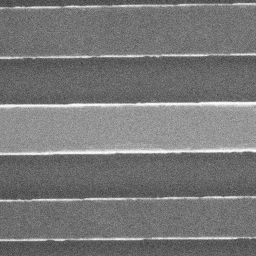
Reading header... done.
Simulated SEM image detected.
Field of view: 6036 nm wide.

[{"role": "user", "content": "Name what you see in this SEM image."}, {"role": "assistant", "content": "lines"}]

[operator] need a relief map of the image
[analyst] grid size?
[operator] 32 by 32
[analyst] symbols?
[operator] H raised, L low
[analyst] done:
LLLLLLLLLLLLLLLLLLLLLLLLLLLLLHHH
HHHHHHHHHHHHHHHHHHHHHHHHHHHHHHHH
HHHHHHHHHHHHHHHHHHHHHHHHHHHHHHHH
HHHHHHHHHHHHHHHHHHHHHHHHHHHHHHHH
HHHHHHHHHHHHHHHHHHHHHHHHHHHHHHHH
HHHHHHHHHHHHHHHHHHHHHHHHHHHHHHHH
HHHHHHHHHHHHHHHHHHHHHHHHHHHHHHHH
LLLLLLLLLLLLLLLLLLLLLLLLLLLLLLLL
LLLLLLLLLLLLLLLLLLLLLLLLLLLLLLLL
LLLLLLLLLLLLLLLLLLLLLLLLLLLLLLLL
LLLLLLLLLLLLLLLLLLLLLLLLLLLLLLLL
LLLLLLLLLLLLLLLLLLLLLLLLLLLLLLLL
LLLLLLLLLLLLLLLLLLLLLLLLLLLLLLLL
HHHHHHHHHHHHHHHHHHHHHHHHHHHHHHHH
HHHHHHHHHHHHHHHHHHHHHHHHHHHHHHHH
HHHHHHHHHHHHHHHHHHHHHHHHHHHHHHHH
HHHHHHHHHHHHHHHHHHHHHHHHHHHHHHHH
HHHHHHHHHHHHHHHHHHHHHHHHHHHHHHHH
HHHHHHHHHHHHHHHHHHHHHHHHHHHHHHHH
LLLLLLLLLLLLLLLLLLLLLLLLLLLLLLLL
LLLLLLLLLLLLLLLLLLLLLLLLLLLLLLLL
LLLLLLLLLLLLLLLLLLLLLLLLLLLLLLLL
LLLLLLLLLLLLLLLLLLLLLLLLLLLLLLLL
LLLLLLLLLLLLLLLLLLLLLLLLLLLLLLLL
LLLLLLLLLLLLLLLLLLLLLLLLLLLLLLLL
HHHHHHHHHHHHHHHHHHHHHHHHHHHHHHHH
HHHHHHHHHHHHHHHHHHHHHHHHHHHHHHHH
HHHHHHHHHHHHHHHHHHHHHHHHHHHHHHHH
HHHHHHHHHHHHHHHHHHHHHHHHHHHHHHHH
HHHHHHHHHHHHHHHHHHHHHHHHHHHHHHHH
LLLLLLLLLLLLLLLLLLLLLLLLLLLLLLLL
LLLLLLLLLLLLLLLLLLLLLLLLLLLLLLLL